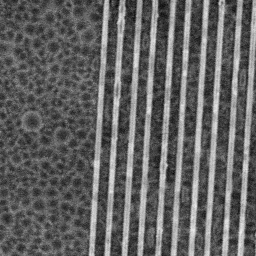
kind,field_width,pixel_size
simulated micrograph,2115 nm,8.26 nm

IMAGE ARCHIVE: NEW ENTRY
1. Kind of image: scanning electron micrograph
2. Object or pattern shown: parallel lines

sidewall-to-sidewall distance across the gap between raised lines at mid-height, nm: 104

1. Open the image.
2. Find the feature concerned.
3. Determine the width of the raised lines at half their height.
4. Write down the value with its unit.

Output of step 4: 31.9 nm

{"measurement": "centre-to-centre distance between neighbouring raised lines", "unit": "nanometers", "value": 136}